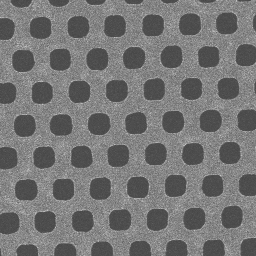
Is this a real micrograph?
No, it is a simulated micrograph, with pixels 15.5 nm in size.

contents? a regular array of holes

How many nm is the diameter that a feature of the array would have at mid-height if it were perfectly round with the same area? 357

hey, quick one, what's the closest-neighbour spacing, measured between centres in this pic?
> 0.57 µm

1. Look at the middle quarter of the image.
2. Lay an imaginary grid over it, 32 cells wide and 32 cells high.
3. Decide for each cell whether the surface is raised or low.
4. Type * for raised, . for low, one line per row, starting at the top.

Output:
.*****.....****.....*****....***
*******...**********************
********************************
*******************************.
**....*****....*****.....****...
*.....*****.....****.....****...
*......***......****.....****...
*......***......****.....****...
*.....*****.....****.....*****..
**...********.******************
********************************
********************************
.*******...******...*****.....**
..****.....****......****.....**
..****......***......***......**
..****......***......****.....**
..****.....****.....*****....***
..*****...*******.**************
********************************
********************************
****..******....*****....*****..
**.....****.....****......****..
**.....****.....****......****..
**.....****.....****......****..
**.....****.....*****....*****..
**....******...*****************
********************************
********************************
.*******...******...******....**
..*****.....****.....****......*
...***......****.....****......*
...***......****.....****......*